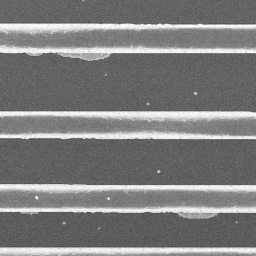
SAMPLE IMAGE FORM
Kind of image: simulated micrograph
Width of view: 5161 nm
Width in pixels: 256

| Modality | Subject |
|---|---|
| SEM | lines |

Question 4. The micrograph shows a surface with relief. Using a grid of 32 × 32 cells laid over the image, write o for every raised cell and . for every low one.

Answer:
................................
................................
................................
oooooooooooooooooooooooooooooooo
oooooooooooooooooooooooooooooooo
oooooooooooooooooooooooooooooooo
..................o..ooooooooooo
................................
................................
................................
................................
................................
................................
................................
oooooooooooooooooooooooooooooooo
oooooooooooooooooooooooooooooooo
oooooooooooooooooooooooooooooooo
................................
................................
................................
................................
................................
................................
oooooooooooooooooooooooooooooooo
oooooooooooooooooooooooooooooooo
oooooooooooooooooooooooooooooooo
.................o.......ooooo.o
................................
................................
................................
................................
oooooooooooooooooooooooooooooooo